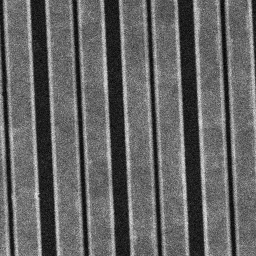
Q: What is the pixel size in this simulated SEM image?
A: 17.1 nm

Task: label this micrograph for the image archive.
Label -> parallel lines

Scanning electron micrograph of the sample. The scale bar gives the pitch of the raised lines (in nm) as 641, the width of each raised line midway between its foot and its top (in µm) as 0.41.